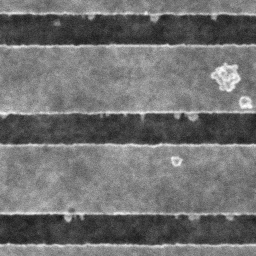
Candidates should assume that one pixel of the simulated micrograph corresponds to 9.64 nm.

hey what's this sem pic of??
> lines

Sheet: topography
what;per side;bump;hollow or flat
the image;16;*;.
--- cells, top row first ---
****************
................
................
****************
****************
****************
****************
................
................
****************
****************
****************
****************
................
................
****************